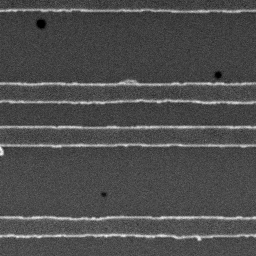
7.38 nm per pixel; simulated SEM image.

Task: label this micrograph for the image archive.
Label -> lines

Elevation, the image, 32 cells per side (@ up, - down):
@@@@@@@@@@@@@@@@@@@@@@@@@@@@@@@@
--------------------------------
--------------------------------
--------------------------------
--------------------------------
--------------------------------
--------------------------------
--------------------------------
--------------------------------
--------------------------------
@@@@-@@@-@----@@@----@@@@@@@-@@@
@@@@@@@@@@@@@@@@@@@@@@@@@@@@@@@@
@@@@@@@@@@@@@@@@@@@@@@@@@@@@@@@@
--------------------------------
--------------------------------
--------------------------------
@@@@@@@@@@@@@@@@@@@@@@@@@@@@@@@@
@@@@@@@@@@@@@@@@@@@@@@@@@@@@@@@@
--------------------------------
--------------------------------
--------------------------------
--------------------------------
--------------------------------
--------------------------------
--------------------------------
--------------------------------
--------------------------------
@@@@@@@@@@@@@@@@@@@@@@@@@@@@@@@@
@@@@@@@@@@@@@@@@@@@@@@@@@@@@@@@@
@@@@@@@@@@@@@@-@@@@@@@@@@@@@@@@@
--------------------------------
--------------------------------